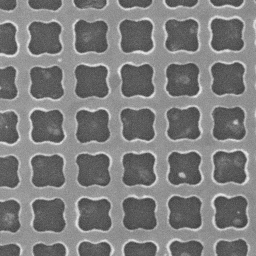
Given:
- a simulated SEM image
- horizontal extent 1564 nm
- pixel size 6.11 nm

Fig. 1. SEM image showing a regular array of holes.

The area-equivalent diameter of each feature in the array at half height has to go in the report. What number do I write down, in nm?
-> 220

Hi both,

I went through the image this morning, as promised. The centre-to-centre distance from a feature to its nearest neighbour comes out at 270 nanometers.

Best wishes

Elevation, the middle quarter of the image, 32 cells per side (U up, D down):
UUUDDDDDDDUUUUUDDDDDDDUUUUDDDDDD
UUUDDDDDDDDUUUDDDDDDDDUUUUDDDDDD
UUUDDDDDDDDUUUDDDDDDDDUUUDDDDDDD
UUUDDDDDDDDUUUDDDDDDDDUUUUDDDDDD
UUUDDDDDDDDUUUDDDDDDDDUUUUDDDDDD
UUUDDDDDDDDUUUDDDDDDDDDUUDDDDDDD
UUUDDDDDDDDUUUDDDDDDDDDUUUDDDDDD
UUUDDDDDDDDUUUUDDDDDDDUUUUDDDDDD
UUUUDDUUUDUUUUUUUUUUUUUUUUUUUUUU
UUUUUUUUUUUUUUUUUUUUUUUUUUUUUUUU
UUUUUUUUUUUUUUUUUUUUUUUUUUUUUUUU
UUUUDUUUDDUUUUUDDDDDDDUUUUDDDDDD
UUUDDDDDDDDUUUDDDDDDDDDUUDDDDDDD
UUUDDDDDDDDUUUDDDDDDDDDUUUDDDDDD
UUUDDDDDDDDUUUDDDDDDDDDUUUDDDDDD
UUUDDDDDDDDUUUDDDDDDDDUUUUDDDDDD
UUUDDDDDDDDUUUDDDDDDDDDUUUDDDDDD
UUUDDDDDDDDDUUDDDDDDDDDUUUDDDDDD
UUUDDDDDDDDUUUUDDDDDDDDUUUDDDDDD
UUUUDDDUDDUUUUUUUUUUUUUUUUUUUUUU
UUUUUUUUUUUUUUUUUUUUUUUUUUUUUUUU
UUUUUUUUUUUUUUUUUUUUUUUUUUUUUUUU
UUUUDDUUDDUUUUUDDDDDDDUUUUDDDDDD
UUUDDDDDDDDUUUUDDDDDDDDUUUDDDDDD
UUUDDDDDDDDDUUUDDDDDDDDUUUDDDDDD
UUUDDDDDDDDUUUUDDDDDDDUUUUDDDDDD
UUUUDDDDDDDUUUUDDDDDDDUUUUDDDDDD
UUUDDDDDDDDUUUUDDDDDDDDUUUDDDDDD
UUUDDDDDDDDDUUDDDDDDDDDUUUDDDDDD
UUUDDDDDDDDUUUUDDDDDDDDUUUDDDDDD
UUUUDDUUUDDUUUUUDUUUUUUUUUUUUUUU
UUUUUUUUUUUUUUUUUUUUUUUUUUUUUUUU